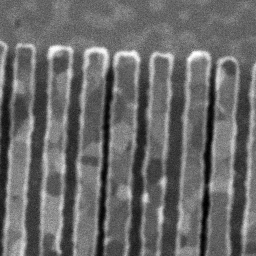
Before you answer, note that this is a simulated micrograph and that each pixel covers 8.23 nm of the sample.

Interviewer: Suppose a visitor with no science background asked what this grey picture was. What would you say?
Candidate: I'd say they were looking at parallel lines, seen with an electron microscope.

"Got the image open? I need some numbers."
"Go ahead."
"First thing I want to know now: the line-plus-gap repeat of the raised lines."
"279 nanometers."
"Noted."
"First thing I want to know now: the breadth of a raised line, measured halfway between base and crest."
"181 nanometres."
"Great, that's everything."